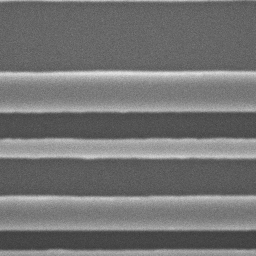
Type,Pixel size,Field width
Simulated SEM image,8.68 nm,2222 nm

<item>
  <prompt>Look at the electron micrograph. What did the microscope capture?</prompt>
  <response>lines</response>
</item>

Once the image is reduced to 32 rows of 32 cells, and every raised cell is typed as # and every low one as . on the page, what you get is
................................
................................
................................
................................
................................
................................
................................
................................
................................
################################
################################
################################
################################
################################
................................
................................
................................
#....####.........#######.######
################################
################################
................................
................................
................................
................................
................................
################################
################################
################################
################################
................................
................................
################################